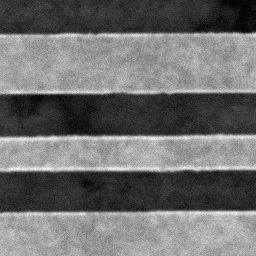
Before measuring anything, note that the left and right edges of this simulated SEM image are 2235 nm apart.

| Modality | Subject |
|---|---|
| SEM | lines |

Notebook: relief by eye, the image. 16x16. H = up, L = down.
LLLLLLLLLLLLLLLL
LLLLLLLLLLLLLLLL
HHHHHHHHHHHHHHHH
HHHHHHHHHHHHHHHH
HHHHHHHHHHHHHHHH
HHHHHHHHHHHHHHHH
LLLLLLLLLLLLLLLL
LLLLLLLLLLLLLLLL
LLLLLLLLLLLLLLLL
HHHHHHHHHHHHHHHH
HHHHHHHHHHHHHHHH
LLLLLLLLLLLLLLLL
LLLLLLLLLLLLLLLL
HHHHHHHHHHHHHHHH
HHHHHHHHHHHHHHHH
HHHHHHHHHHHHHHHH